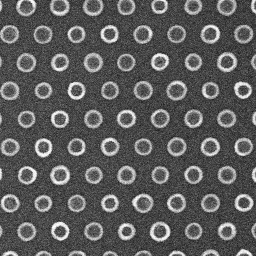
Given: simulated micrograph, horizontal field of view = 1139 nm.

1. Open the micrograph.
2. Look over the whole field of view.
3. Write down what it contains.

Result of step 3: a regular array of raised bodies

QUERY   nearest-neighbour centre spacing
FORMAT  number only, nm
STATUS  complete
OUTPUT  144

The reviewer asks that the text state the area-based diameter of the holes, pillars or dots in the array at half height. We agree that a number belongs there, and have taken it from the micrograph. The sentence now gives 75.4 nm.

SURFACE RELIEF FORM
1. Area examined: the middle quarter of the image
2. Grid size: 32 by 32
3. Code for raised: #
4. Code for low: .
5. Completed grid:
#....####.....###.....####.....#
......##.......##...............
................................
................................
...........................##...
.####.....###.....####....####..
.####.....###.....####....####..
.####.....###.....####....####..
..##.......#.......##......##...
................................
................................
........................#.......
#.....###.....####....####.....#
#....####....#####....####....##
#....####.....###.....####.....#
......##......###......##......#
................................
................................
................................
..###.....###.....###......###..
.####....####.....####....####..
.####.....###.....####....####..
..##.......#.......##......##...
................................
................................
................................
#.....###.....###......###.....#
#.....###.....####....####....##
#.....###.....####....####....##
.......#......###......##......#
................................
................................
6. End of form